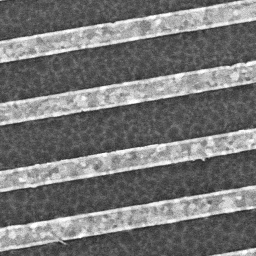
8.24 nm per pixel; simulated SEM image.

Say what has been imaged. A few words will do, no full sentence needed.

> one or a few lines or trenches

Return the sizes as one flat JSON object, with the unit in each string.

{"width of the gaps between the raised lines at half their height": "357 nm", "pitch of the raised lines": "61.7 px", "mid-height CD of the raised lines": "152 nanometers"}